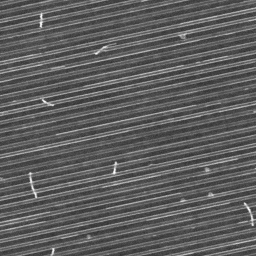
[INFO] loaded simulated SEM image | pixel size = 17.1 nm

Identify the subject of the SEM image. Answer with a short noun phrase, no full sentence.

parallel lines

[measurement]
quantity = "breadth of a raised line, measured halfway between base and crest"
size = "52.2 nanometers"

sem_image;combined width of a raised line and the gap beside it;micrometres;0.141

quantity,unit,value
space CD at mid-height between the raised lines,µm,0.0919